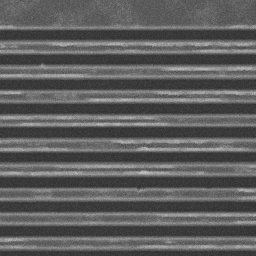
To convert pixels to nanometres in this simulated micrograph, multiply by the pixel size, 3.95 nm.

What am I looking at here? parallel lines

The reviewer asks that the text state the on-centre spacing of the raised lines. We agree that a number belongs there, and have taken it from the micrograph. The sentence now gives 0.0967 microns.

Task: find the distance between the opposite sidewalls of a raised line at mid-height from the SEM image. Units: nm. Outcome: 46.4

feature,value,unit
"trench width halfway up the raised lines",12.6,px